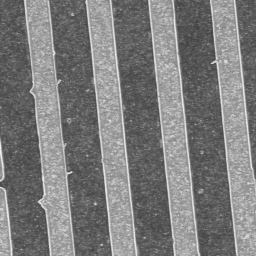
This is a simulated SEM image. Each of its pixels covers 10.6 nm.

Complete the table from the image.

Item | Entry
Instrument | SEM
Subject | one or a few lines or trenches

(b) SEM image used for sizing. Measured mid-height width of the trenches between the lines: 406 nm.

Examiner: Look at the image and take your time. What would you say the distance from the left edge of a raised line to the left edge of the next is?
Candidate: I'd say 658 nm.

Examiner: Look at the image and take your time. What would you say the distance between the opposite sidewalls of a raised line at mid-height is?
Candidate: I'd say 23.6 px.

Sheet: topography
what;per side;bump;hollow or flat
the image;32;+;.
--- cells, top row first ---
...+++.....+++.....+++....+++...
...+++.....+++.....+++.....++...
...+++.....+++.....+++.....+++..
...+++.....+++.....+++.....+++..
....++.....+++.....+++.....+++..
....+++....+++.....+++.....+++..
....+++.....++.....+++.....+++..
....+++.....+++....+++.....+++..
....+++.....+++....+++.....+++..
....+++.....+++.....++.....+++..
....+++.....+++.....+++....+++..
....+++.....+++.....+++.....++..
....+++.....+++.....+++.....+++.
....+++.....+++.....+++.....+++.
.....++.....+++.....+++.....+++.
.....+++....+++.....+++.....+++.
.....+++.....++.....+++.....+++.
.....+++.....+++....+++.....+++.
.....+++.....+++....+++.....+++.
.....+++.....+++.....+++....+++.
.....+++.....+++.....+++....+++.
.....+++.....+++.....+++.....+++
.....+++.....+++.....+++.....+++
.....+++.....+++.....+++.....+++
+....++++....+++.....+++.....+++
+....++++....+++.....+++.....+++
+.....+++.....++.....+++.....+++
+.....+++.....+++....+++.....+++
+.....+++.....+++.....++.....+++
+.....+++.....+++.....+++....+++
+.....+++.....+++.....+++....+++
+.....+++.....+++.....+++.....++